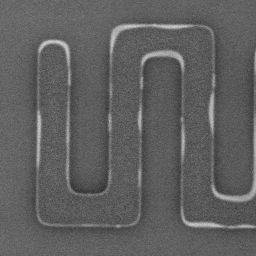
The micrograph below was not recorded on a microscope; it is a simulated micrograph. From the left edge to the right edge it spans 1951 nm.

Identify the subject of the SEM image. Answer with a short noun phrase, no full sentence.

groups of lines, slits or small figures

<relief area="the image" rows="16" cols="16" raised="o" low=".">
................
................
.......oooooo...
..oo...oo..oo...
..oo...oo..oo...
..oo...oo..oo...
..oo...oo..oo...
..oo...oo..oo...
..oo...oo..oo...
..oo...oo..oo...
..oo...oo..oo...
..oo...oo..oo...
..ooooooo..ooooo
..ooooooo..ooooo
................
................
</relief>